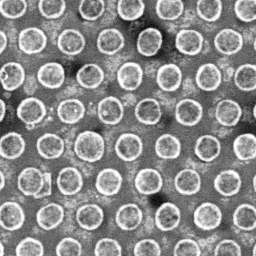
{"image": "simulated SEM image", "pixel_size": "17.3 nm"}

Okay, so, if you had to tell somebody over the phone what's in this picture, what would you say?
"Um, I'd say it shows a regular array of raised bodies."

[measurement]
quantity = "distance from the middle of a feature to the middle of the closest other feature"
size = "674 nm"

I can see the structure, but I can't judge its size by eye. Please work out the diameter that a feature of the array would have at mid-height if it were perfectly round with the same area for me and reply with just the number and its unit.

425 nm